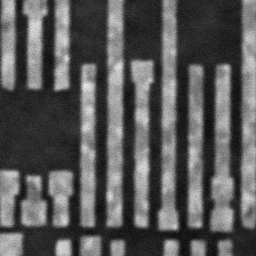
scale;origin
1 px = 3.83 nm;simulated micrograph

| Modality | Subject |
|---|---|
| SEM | wiring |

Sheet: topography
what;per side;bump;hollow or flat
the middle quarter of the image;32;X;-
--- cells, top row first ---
X----XX----XXX---XXXXX---XXX----
X----XXX---XXX---XXXXX---XXX---X
X----XXX---XXX---XXXXX---XXX---X
X----XX----XXX---XXXXX---XXX----
X----XX----XXX----XXXX---XXX---X
X----XX----XXX----XXX----XXX---X
-----XX----XXX----XXX----XXX---X
-----XX----XXX----XXX----XXX---X
-----XX----XXX----XXX----XXX---X
-----XX----XXX----XXX----XXX---X
-----XX----XXX----XXX----XXX---X
-----XX----XXX----XXX----XXX---X
-----XX----XXX----XXX----XXX---X
-----XX----XXX----XXX----XXX---X
-----XX----XXX----XXX----XXX---X
-----XX----XXX----XXX----XXX---X
-----XX----XXX----XXX----XXX---X
-----XX----XXX----XXX----XXX---X
-----XX----XXX----XXX----XXX---X
-----XX----XXX----XXX----XXX---X
-----XX----XXX----XXX----XXX---X
-----XXX---XXX----XXX----XXX---X
-----XX----XXX----XXX----XXX---X
-----XX----XXX----XXX----XXX---X
----XXX----XXX----XXX----XXX---X
----XXX----XXX----XXX----XXX---X
-----XX----XXX----XXX----XXX---X
XX---XX----XXX----XXX----XXX---X
XX--XXX----XXX----XXX----XXX---X
XX--XXX----XXX----XXX----XXX---X
XX---XX----XXX----XXX----XXX---X
XX--XXX----XXX----XXX----XXX---X